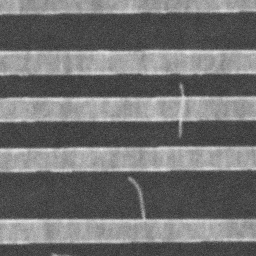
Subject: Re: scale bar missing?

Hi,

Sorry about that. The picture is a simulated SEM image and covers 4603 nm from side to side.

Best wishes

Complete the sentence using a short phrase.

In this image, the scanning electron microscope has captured lines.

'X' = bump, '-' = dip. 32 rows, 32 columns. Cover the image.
XXXXXXXXXXXXXXXXXXXXXXXXXXXXXXXX
XXXXXXXXXXXXXXXXXX--------------
--------------------------------
--------------------------------
--------------------------------
--------------------------------
--XXXXXXXXXXXXXXXXXXXXXXXXXXXXXX
XXXXXXXXXXXXXXXXXXXXXXXXXXXXXXXX
XXXXXXXXXXXXXXXXXXXXXXXXXXXXXXXX
--------------------------------
--------------------------------
--------------------------------
XXXXXXXXXXXXXXXXXXXXXXXXXXXXXXXX
XXXXXXXXXXXXXXXXXXXXXXXXXXXXXXXX
XXXXXXXXXXXXXXXXXXXXXXXXXXXXXXXX
--------------------------------
--------------------------------
--------------------------------
----------------------XXXXXXXXXX
XXXXXXXXXXXXXXXXXXXXXXXXXXXXXXXX
XXXXXXXXXXXXXXXXXXXXXXXXXXXXXXXX
--------------------------------
--------------------------------
--------------------------------
--------------------------------
--------------------------------
--------------------------------
------------------X-------------
XXXXXXXXXXXXXXXXXXXXXXXXXXXXXXXX
XXXXXXXXXXXXXXXXXXXXXXXXXXXXXXXX
--------------------------------
--------------------------------